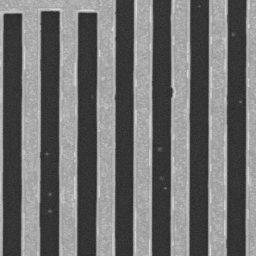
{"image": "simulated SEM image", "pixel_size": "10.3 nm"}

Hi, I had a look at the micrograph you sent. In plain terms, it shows parallel lines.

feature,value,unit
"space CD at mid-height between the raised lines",213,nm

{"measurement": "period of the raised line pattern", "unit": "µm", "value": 0.386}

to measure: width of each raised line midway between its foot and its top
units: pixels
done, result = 16.9